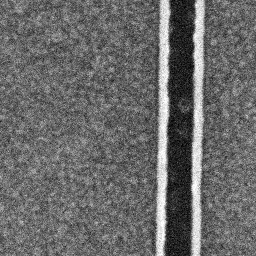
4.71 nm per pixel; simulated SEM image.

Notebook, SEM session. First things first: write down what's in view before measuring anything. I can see one or a few lines or trenches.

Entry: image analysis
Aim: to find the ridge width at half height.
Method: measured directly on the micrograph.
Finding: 174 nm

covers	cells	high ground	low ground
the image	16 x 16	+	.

..........+++...
..........+++...
..........+++...
..........+++...
..........++....
..........++....
..........++....
..........++....
..........++....
..........++....
..........++....
..........++....
..........++....
..........++....
..........++....
..........++....